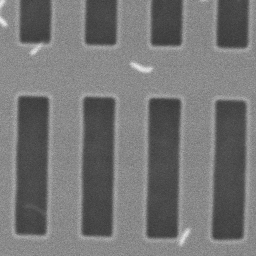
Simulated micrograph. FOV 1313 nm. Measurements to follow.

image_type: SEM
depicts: groups of lines, slits or small figures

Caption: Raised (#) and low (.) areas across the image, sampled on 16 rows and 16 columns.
#..##..##..###..
#..##..##..###..
#..##..##..###.#
################
################
################
#..##..##..###.#
#..##..##..##..#
#..##..##..##..#
#..##..##..##..#
#..##..##..##..#
#..##..##..##..#
#..##..##..##..#
#..##..##..##..#
#..##..##..##..#
################